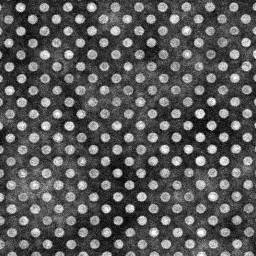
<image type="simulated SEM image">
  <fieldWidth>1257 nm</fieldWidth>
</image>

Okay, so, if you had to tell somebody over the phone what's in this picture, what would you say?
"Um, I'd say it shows a regular array of raised bodies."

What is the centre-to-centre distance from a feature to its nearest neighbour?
0.0811 microns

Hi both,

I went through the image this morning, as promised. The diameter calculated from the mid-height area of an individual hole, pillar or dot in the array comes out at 44.3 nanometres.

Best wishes